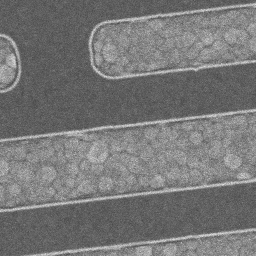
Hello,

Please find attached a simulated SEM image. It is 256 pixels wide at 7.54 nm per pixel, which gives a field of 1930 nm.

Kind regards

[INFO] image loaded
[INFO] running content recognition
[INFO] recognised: one or a few lines or trenches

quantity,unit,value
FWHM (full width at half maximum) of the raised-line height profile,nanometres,372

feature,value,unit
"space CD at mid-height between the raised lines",69.1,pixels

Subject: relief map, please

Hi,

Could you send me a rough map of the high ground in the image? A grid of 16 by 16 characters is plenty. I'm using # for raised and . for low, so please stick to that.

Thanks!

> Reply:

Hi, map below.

##############..
#######.........
.#####..........
.#####..........
######....######
.###############
################
###########.....
###.............
................
................
..............##
.....###########
################
###############.
######..........